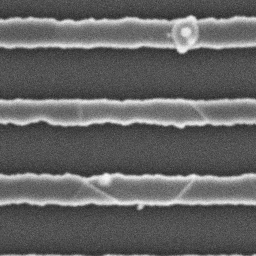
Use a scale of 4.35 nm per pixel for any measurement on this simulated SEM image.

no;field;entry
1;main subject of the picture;lines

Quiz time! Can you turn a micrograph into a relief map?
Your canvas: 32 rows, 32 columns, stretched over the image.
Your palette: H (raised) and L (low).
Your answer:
LLLLLLLLLLLLLLLLLLLLLLLLLLLLLLLL
LLLLLLLLLLLLLLLLLLLLLLLLLLLLLLLL
HHHHHHHLLLLHLHLHHHHHLLHHHHHHHHHH
HHHHHHHHHHHHHHHHHHHHHHHHHHHHHHHH
HHHHHHHHHHHHHHHHHHHHHHHHHHHHHHHH
HHHHHHHHHHHHHHHHHHHHHHHHHHHHHHHH
LLLLLLLLLLLLLLLLLLLLLLLLLLLLLLLL
LLLLLLLLLLLLLLLLLLLLLLLLLLLLLLLL
LLLLLLLLLLLLLLLLLLLLLLLLLLLLLLLL
LLLLLLLLLLLLLLLLLLLLLLLLLLLLLLLL
LLLLLLLLLLLLLLLLLLLLLLLLLLLLLLLL
LLLLLLLLLLLLLLLLLLLLLLLLLLLLLLLL
LLLLLLLLLLLLLLLLLLLHHLHLLLLLHHHH
HHHHHHHHHHHHHHHHHHHHHHHHHHHHHHHH
HHHHHHHHHHHHHHHHHHHHHHHHHHHHHHHH
LLHLLLLHHHHLLLLHLLLLHHHHHHHHHLLL
LLLLLLLLLLLLLLLLLLLLLLLLLLLLLLLL
LLLLLLLLLLLLLLLLLLLLLLLLLLLLLLLL
LLLLLLLLLLLLLLLLLLLLLLLLLLLLLLLL
LLLLLLLLLLLLLLLLLLLLLLLLLLLLLLLL
LLLLLLLLLLLLLLLLLLLLLLLLLLLLLLLL
LLLLLLLLLLLLLLLLLLLLLLLLLLLLLLLL
HHHHHHHHHHHHHHHHHHHHHHHHHHHHHHHH
HHHHHHHHHHHHHHHHHHHHHHHHHHHHHHHH
HHHHHHHHHHHHHHHHHHHHHHHHHHHHHHHH
LLLLLHLHHHLLLLLHLLHHHLLLLLLLLLLL
LLLLLLLLLLLLLLLLLLLLLLLLLLLLLLLL
LLLLLLLLLLLLLLLLLLLLLLLLLLLLLLLL
LLLLLLLLLLLLLLLLLLLLLLLLLLLLLLLL
LLLLLLLLLLLLLLLLLLLLLLLLLLLLLLLL
LLLLLLLLLLLLLLLLLLLLLLLLLLLLLLLL
LLLLLLLLLLLLLLLLLLLLLLLLLLLLLLLL